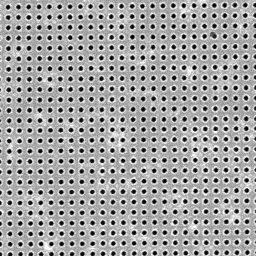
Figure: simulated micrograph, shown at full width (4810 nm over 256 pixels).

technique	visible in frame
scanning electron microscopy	a regular array of holes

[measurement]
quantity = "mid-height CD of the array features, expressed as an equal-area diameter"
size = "0.0995 um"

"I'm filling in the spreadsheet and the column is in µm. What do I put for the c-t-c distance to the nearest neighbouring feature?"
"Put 0.188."